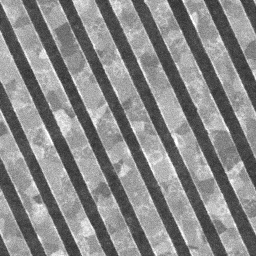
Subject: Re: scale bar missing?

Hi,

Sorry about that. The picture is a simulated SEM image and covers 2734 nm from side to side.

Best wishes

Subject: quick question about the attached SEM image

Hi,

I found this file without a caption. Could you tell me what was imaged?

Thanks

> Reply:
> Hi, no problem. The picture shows parallel lines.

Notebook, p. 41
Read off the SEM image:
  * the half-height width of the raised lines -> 210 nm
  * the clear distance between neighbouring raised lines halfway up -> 139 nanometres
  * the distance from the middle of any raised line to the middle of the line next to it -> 0.352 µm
